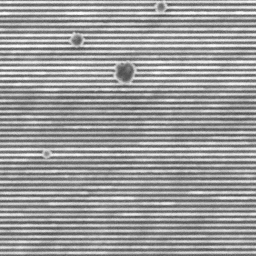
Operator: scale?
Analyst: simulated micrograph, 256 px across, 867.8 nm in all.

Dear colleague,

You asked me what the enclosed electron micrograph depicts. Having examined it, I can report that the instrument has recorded parallel lines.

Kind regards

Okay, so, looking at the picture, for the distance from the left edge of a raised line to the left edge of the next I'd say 18.5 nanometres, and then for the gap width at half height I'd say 13.1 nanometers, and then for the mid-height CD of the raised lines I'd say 5.5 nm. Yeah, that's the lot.